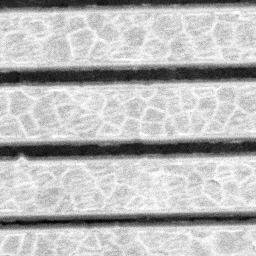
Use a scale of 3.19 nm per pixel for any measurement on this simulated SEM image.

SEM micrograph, one or a few lines or trenches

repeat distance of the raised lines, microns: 0.238